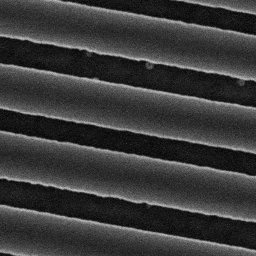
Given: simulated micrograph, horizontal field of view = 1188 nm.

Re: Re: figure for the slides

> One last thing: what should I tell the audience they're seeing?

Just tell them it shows lines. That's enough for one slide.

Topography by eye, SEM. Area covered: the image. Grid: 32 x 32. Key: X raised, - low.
XXXXXXXXXX---------------XXXXXXX
XXXXXXXXXXXXXXXX--------------XX
XXXXXXXXXXXXXXXXXXXXX-----------
XXXXXXXXXXXXXXXXXXXXXXXXXXX-----
XXXXXXXXXXXXXXXXXXXXXXXXXXXXXXXX
------XXXXXXXXXXXXXXXXXXXXXXXXXX
------------XXXXXXXXXXXXXXXXXXXX
-----------------XXXXXXXXXXXXXXX
XXXX-------------------XXXXXXXXX
XXXXXXXXX--------------------XXX
XXXXXXXXXXXXXXX-----------------
XXXXXXXXXXXXXXXXXXXXX-----------
XXXXXXXXXXXXXXXXXXXXXXXXXX------
XXXXXXXXXXXXXXXXXXXXXXXXXXXXXXXX
-----XXXXXXXXXXXXXXXXXXXXXXXXXXX
-----------XXXXXXXXXXXXXXXXXXXXX
X----------------XXXXXXXXXXXXXXX
XXXXXXX----------------XXXXXXXXX
XXXXXXXXXXXX----------------XXXX
XXXXXXXXXXXXXXXXXX--------------
XXXXXXXXXXXXXXXXXXXXXXXX--------
XXXXXXXXXXXXXXXXXXXXXXXXXXXXX---
--XXXXXXXXXXXXXXXXXXXXXXXXXXXXXX
-------XXXXXXXXXXXXXXXXXXXXXXXXX
------------XXXXXXXXXXXXXXXXXXXX
-------------------XXXXXXXXXXXXX
XXXXX-------------------XXXXXXXX
XXXXXXXXXX--------------------XX
XXXXXXXXXXXXXXXX----------------
XXXXXXXXXXXXXXXXXXXXXX----------
XXXXXXXXXXXXXXXXXXXXXXXXXXXX----
XXXXXXXXXXXXXXXXXXXXXXXXXXXXXXXX